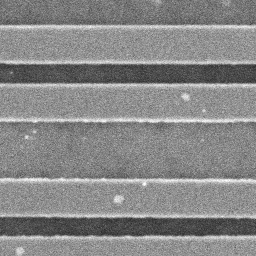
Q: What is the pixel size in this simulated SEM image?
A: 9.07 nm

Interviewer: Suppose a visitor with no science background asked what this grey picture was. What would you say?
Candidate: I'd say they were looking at lines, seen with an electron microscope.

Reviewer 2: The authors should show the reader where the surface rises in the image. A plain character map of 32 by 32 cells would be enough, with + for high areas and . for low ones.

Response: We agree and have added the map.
................................
................................
................................
++++++++++++++++++++++++++++++++
++++++++++++++++++++++++++++++++
++++++++++++++++++++++++++++++++
++++++++++++++++++++++++++++++++
++++++++++++++++++++++++++++++++
................................
................................
................................
++++++++++++++++++++++++++++++++
++++++++++++++++++++++++++++++++
++++++++++++++++++++++++++++++++
++++++++++++++++++++++++++++++++
................................
................................
................................
................................
................................
................................
................................
++++++++++++++++++++++++++++++++
++++++++++++++++++++++++++++++++
++++++++++++++++++++++++++++++++
++++++++++++++++++++++++++++++++
++++++++++++++++++++++++++++++++
................................
................................
................................
++++++++++++++++++++++++++++++++
++++++++++++++++++++++++++++++++